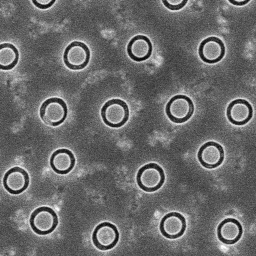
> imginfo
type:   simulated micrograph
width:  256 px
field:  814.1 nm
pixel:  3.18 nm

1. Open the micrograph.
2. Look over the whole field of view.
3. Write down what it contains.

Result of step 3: a regular array of ring-shaped grooves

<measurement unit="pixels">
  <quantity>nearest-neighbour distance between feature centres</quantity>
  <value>53.3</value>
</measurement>